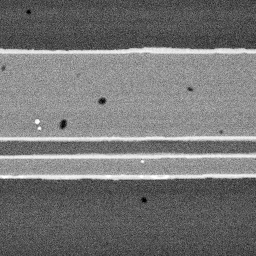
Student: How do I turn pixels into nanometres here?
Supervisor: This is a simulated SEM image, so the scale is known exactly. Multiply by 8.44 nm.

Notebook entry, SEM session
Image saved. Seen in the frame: lines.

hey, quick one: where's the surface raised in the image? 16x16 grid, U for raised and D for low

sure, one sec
DDDDDDDDDDDDDDDD
DDDDDDDDDDDDDDDD
DDDDDDDDDDDDDDDD
UUUUUUUUUUUUUUUU
UUUUUUUUUUUUUUUU
UUUUUUUUUUUUUUUU
UUUUUUUUUUUUUUUU
UUUUUUUUUUUUUUUU
UUUUUUUUUUUUUUUU
UUUUUUUUUUUUUUUU
UUUUUUUUUUUUUUUU
DDDDDDDDDDDDDDDD
DDDDDDDDDDDDDDDD
DDDDDDDDDDDDDDDD
DDDDDDDDDDDDDDDD
DDDDDDDDDDDDDDDD